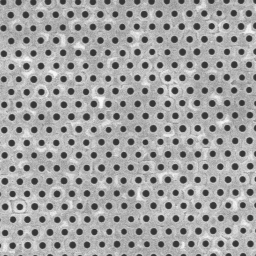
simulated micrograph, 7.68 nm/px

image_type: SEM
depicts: a regular array of holes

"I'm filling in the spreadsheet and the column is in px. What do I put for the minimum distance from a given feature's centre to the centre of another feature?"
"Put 14.4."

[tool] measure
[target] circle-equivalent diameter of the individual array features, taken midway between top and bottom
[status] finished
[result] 6.28 pixels